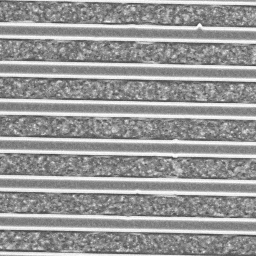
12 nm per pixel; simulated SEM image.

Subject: parallel lines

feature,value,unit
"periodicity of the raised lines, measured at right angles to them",458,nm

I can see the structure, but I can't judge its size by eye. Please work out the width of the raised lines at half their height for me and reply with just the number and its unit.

168 nm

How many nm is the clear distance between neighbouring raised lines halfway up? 295